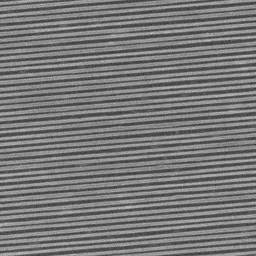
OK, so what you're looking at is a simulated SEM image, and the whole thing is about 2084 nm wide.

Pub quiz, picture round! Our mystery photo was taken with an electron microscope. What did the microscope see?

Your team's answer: parallel lines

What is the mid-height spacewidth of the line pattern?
0.0274 um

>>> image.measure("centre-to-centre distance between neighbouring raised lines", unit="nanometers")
49.8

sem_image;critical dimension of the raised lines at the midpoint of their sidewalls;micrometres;0.0233